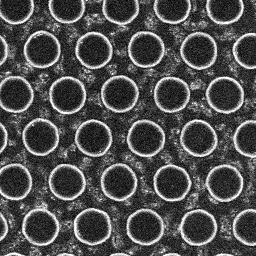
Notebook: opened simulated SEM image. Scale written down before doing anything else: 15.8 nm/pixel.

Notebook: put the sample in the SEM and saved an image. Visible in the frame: a regular array of raised bodies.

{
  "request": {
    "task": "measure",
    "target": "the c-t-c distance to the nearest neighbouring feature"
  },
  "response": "809 nm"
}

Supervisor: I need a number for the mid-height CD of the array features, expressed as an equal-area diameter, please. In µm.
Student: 0.542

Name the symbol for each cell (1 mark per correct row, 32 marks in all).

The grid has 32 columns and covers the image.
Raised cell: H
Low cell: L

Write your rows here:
HHHHLLHHHHLLLHHHHLLHHHHHLLHHHHLL
HHHHLLHHHHLLLHHHHLLLHHHLLLHHHHLL
LHHLLLLHHLLLLLHHLLLLHHHLLLLHHLLL
LLLLLLLLLLLLLLLLLLLLLLLLLLLLLLLL
LLLLHHLLLLLHHLLLLHHLLLLLHHLLLLLH
HLLHHHHLLLHHHHLLHHHHLLLHHHHLLLHH
HLLHHHHLLLHHHHLLHHHHLLLHHHHLLHHH
LLLLHHHLLLHHHLLLLHHHLLLHHHHLLLHH
LLLLLLLLLLLLLLLLLLLLLLLLLLLLLLLL
LLLLLLLLLLLLLLLLLLLLLLLLLLLLLLLL
HHHLLLLHHHLLLHHHHLLLHHHLLLHHHHLL
HHHHLLHHHHLLLHHHHLLHHHHHLLHHHHLL
HHHHLLHHHHLLLHHHHLLLHHHLLLHHHHLL
LHHLLLLHHHLLLLHHLLLLHHHLLLLHHHLL
LLLLLLLLLLLLLLLLLLLLLLLLLLLLLLLL
LLLLHHLLLLLHHLLLLHHLLLLLHHLLLLHH
HLLHHHHLLLHHHHLLHHHHLLLHHHHLLLHH
HLLHHHHLLLHHHHLLHHHHLLLHHHHLLHHH
LLLLHHHLLLHHHLLLHHHHLLLHHHHLLLHH
LLLLLLLLLLLLLLLLLLLLLLLLLLLLLLLH
LLLLLLLLLLLLLLLLLLLLLLLLLLLLLLLL
HHHLLLLHHHLLLHHHLLLLHHHLLLHHHHLL
HHHHLLHHHHLLLHHHHLLHHHHHLLHHHHLL
HHHHLLHHHHLLLHHHHLLLHHHHLLHHHHLL
LHHLLLLHHHLLLLHHLLLLHHHLLLLHHLLL
LLLLLLLLLLLLLLLLLLLLLLLLLLLLLLLL
LLLLHHLLLLLHHLLLLHHLLLLLHLLLLLLH
HLLHHHHLLLHHHHLLHHHHLLLHHHHLLLHH
HLLHHHHLLHHHHHLLHHHHLLLHHHHLLHHH
LLLHHHHLLLHHHLLLHHHHLLLHHHHLLLHH
LLLLLHLLLLLLLLLLLLLLLLLLLLLLLLLL
LLLLLLLLLLLLLLLLLLLLLLLLLLLLLLLL